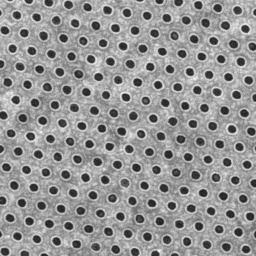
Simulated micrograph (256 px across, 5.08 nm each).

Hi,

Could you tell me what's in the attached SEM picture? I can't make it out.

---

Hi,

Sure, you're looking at a regular array of holes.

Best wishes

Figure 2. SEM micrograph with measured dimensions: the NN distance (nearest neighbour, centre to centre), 97.5 nm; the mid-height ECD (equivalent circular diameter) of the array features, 9.59 px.